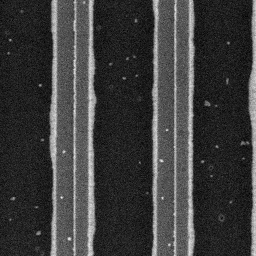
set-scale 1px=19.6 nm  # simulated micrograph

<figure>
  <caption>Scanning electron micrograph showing lines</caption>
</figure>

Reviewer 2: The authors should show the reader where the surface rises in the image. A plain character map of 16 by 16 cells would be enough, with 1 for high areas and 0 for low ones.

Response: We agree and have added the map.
0001110000110000
0001110000110000
0001110000110000
0001110000110000
0001110000110000
0001110000110000
0001110000110000
0001110000110000
0001110000110000
0001110000110000
0001110000110000
0001110000110000
0001110000110000
0001110000110000
0001110000110000
0001110000110000